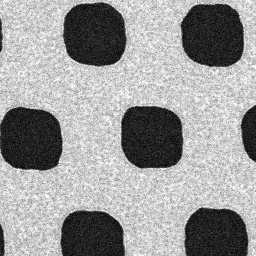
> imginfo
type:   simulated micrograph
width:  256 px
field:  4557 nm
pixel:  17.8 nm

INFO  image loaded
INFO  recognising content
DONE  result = holes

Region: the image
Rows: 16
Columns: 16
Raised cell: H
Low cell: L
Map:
HHHHHLLHHHHHLLLH
HHHHLLLLHHHLLLLH
HHHHLLLLHHHLLLLH
HHHHLLLLHHHHLLLH
HHHHHHHHHHHHHHHH
HHHHHHHHHHHHHHHH
HHHHHHHHHHHHHHHH
LLLLHHHHLLLHHHHL
LLLLHHHHLLLHHHHL
LLLLHHHHLLLHHHHL
HLLHHHHHHLHHHHHH
HHHHHHHHHHHHHHHH
HHHHHHHHHHHHHHHH
HHHHLLLHHHHHLLLH
HHHHLLLLHHHHLLLH
HHHHLLLLHHHHLLLL